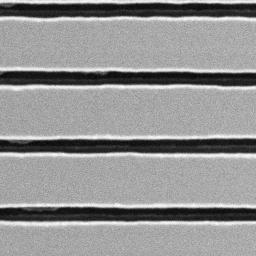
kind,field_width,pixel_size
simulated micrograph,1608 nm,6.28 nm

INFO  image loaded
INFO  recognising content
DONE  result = lines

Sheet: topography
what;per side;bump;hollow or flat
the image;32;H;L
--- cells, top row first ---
LLLLLLLLLLLLLLLLLLLLLLLLLLLLLLLL
LLLLLLLLLLLLLLLLLLLLLLLLLLLLLLLL
HHHHHHHHHHHHHHHHHHHHHHHHHHHHHHHH
HHHHHHHHHHHHHHHHHHHHHHHHHHHHHHHH
HHHHHHHHHHHHHHHHHHHHHHHHHHHHHHHH
HHHHHHHHHHHHHHHHHHHHHHHHHHHHHHHH
HHHHHHHHHHHHHHHHHHHHHHHHHHHHHHHH
HHHHHHHHHHHHHHHHHHHHHHHHHHHHHHHH
HHHHHHHHHHHHHHHHHHHHHHHHHHHHHHHH
LLLLLLLLLLLLLLLLLLLLLLLLLLLLLLLL
LLLLLLLLLLLLLLLLLLLLLLLLLLLLLLLL
HHHHHHHHHHHHHHHHHHHHHHHHHHHHHHHH
HHHHHHHHHHHHHHHHHHHHHHHHHHHHHHHH
HHHHHHHHHHHHHHHHHHHHHHHHHHHHHHHH
HHHHHHHHHHHHHHHHHHHHHHHHHHHHHHHH
HHHHHHHHHHHHHHHHHHHHHHHHHHHHHHHH
HHHHHHHHHHHHHHHHHHHHHHHHHHHHHHHH
LLLLLLLLLLLLLLLLLLLLLLLLLLLLLLLL
LLLLLLLLLLLLLLLLLLLLLLLLLLLLLLLL
HHHHHHHHHHHHHHHHHHHHHHHHHHHHHHHH
HHHHHHHHHHHHHHHHHHHHHHHHHHHHHHHH
HHHHHHHHHHHHHHHHHHHHHHHHHHHHHHHH
HHHHHHHHHHHHHHHHHHHHHHHHHHHHHHHH
HHHHHHHHHHHHHHHHHHHHHHHHHHHHHHHH
HHHHHHHHHHHHHHHHHHHHHHHHHHHHHHHH
HHHHHHHHHHHHHHHHHHHHHHHHHHHHHHHH
LLLLLLLLLLLLLLLLLLLLLLLLLLLLLLLL
LLLLLLLLLLLLLLLLLLLLLLLLLLLLLLLL
HHHHHHHHHHHHHHHHHHHHHHHHHHHHHHHH
HHHHHHHHHHHHHHHHHHHHHHHHHHHHHHHH
HHHHHHHHHHHHHHHHHHHHHHHHHHHHHHHH
HHHHHHHHHHHHHHHHHHHHHHHHHHHHHHHH